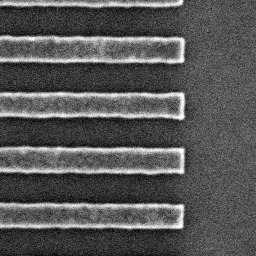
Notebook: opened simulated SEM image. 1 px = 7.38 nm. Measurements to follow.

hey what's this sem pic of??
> wiring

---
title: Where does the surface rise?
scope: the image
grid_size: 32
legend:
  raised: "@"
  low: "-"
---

@@@@@@@@@@@@@@@@@@@@@@----------
--------------------------------
--------------------------------
--------------------------------
--------------------------------
@@@@@@@@@@@@@@@@@@@@@@@---------
@@@@@@@@@@@@@@@@@@@@@@@---------
@@@@@@@@@@@@@@@@@@@@@@@---------
--------------------------------
--------------------------------
--------------------------------
--------------------------------
@@@@@@@@@@@@@@@@@@@@@@@---------
@@@@@@@@@@@@@@@@@@@@@@@---------
---@@@@@@------@@@@@@@@---------
--------------------------------
--------------------------------
--------------------------------
--@@----------------------------
@@@@@@@@@@@@@@@@@@@@@@@---------
@@@@@@@@@@@@@@@@@@@@@@@---------
---@-@@@-@@@@@@@@@@@@@@---------
--------------------------------
--------------------------------
--------------------------------
@@@-@@@@@-@---------------------
@@@@@@@@@@@@@@@@@@@@@@@---------
@@@@@@@@@@@@@@@@@@@@@@@---------
----------------@-@@------------
--------------------------------
--------------------------------
--------------------------------